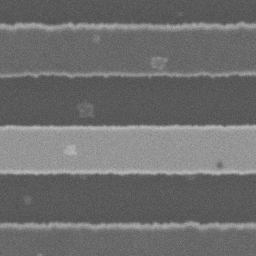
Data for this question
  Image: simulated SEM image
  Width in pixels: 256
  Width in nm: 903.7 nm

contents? lines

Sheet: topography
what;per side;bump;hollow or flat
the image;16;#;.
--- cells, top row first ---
................
................
################
################
################
................
................
................
################
################
################
................
................
................
################
################